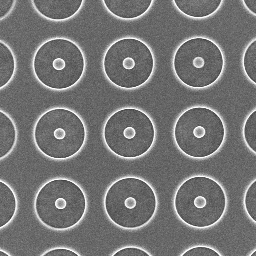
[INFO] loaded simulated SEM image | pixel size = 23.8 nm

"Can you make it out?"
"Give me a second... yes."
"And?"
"an array of small figures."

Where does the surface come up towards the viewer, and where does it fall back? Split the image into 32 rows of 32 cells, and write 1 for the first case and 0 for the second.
00110000001110000001110000001110
01111000001111000011111000011111
11111111111111111111111111111111
11111111111111111111111111111111
11111111111111111111111111111111
01111000011111000011111000011110
01111000001110000001110000001110
00110001001110000001110010001100
00110001001110000001110000001110
01111000001110000001110000011110
01111000011111000011111000111111
11111111111111111111111111111111
11111111111111111111111111111111
11111111111111111111111100111111
01111000001111000011111000011110
00111000001110000001110000001110
00110001000110001001110011001100
00110000000110000001110000001110
01111000001111000001111000011110
01111100011111100111111100111111
11111111111111111111111111111111
11111111111111111111111111111111
11111110111111100011111000011111
01111000001111000001110000001110
00111000000110000001110000001110
00110001000110001000110011001110
00111000000110000001110000001110
01111000001111000001111000011111
11111110111111110111111111111111
11111111111111111111111111111111
11111111111111111111111111111111
11111100011111100011111000011111